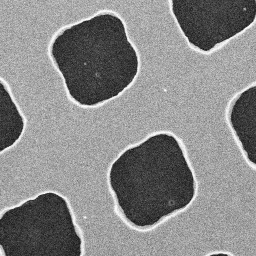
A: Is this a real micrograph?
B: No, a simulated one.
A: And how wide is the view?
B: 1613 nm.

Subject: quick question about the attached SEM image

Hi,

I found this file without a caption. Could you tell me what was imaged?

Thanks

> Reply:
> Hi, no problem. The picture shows holes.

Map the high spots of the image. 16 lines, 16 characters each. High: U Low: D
UUUUUUUUUUUDDDDD
UUUUUDDDUUUDDDDD
UUUDDDDDUUUUDDUU
UUUDDDDDDUUUUUUU
UUUUDDDDDUUUUUUU
UUUUDDDDUUUUUUUU
DUUUUDUUUUUUUUDD
DUUUUUUUUUUUUUDD
DUUUUUUUUUDUUUUD
UUUUUUUUDDDUUUUD
UUUUUUUDDDDDUUUU
UUUUUUUDDDDDUUUU
UUDDUUUDDDDDUUUU
DDDDUUUUDDDUUUUU
DDDDDUUUUUUUUUUU
DDDDDUUUUUUUUUUU